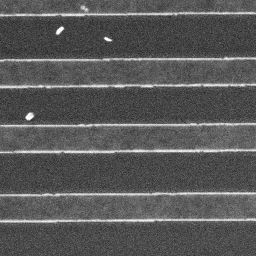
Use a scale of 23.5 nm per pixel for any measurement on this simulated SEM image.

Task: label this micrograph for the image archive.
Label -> lines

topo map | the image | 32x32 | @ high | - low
@@@@@@@@@@@@@@@@@@@@@@@@@@@@@@@@
@@@@@@@@@@@@@@@@@@@@@@@@@@@@@@@@
--------------------------------
--------------------------------
--------------------------------
--------------------------------
--------------------------------
-------------@@@@@@@@@@@@@@@@@@@
@@@@@@@@@@@@@@@@@@@@@@@@@@@@@@@@
@@@@@@@@@@@@@@@@@@@@@@@@@@@@@@@@
@@@@@@@@@@@@@@@@@@@@@@@@@@@@@@@@
--------------------------------
--------------------------------
--------------------------------
--------------------------------
--------------------------------
@@@@@@@@@@@@@@@@@@@@@@@@@@@@@@@@
@@@@@@@@@@@@@@@@@@@@@@@@@@@@@@@@
@@@@@@@@@@@@@@@@@@@@@@@@@@@@@@@@
--------------------------------
--------------------------------
--------------------------------
--------------------------------
--------------------------------
@@@@@@@@@@@@@@@@@@@@@@@@@@@@@@@@
@@@@@@@@@@@@@@@@@@@@@@@@@@@@@@@@
@@@@@@@@@@@@@@@@@@@@@@@@@@@@@@@@
@@@@@@@@@@@@@@@@@@@-------------
--------------------------------
--------------------------------
--------------------------------
--------------------------------